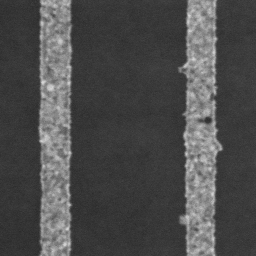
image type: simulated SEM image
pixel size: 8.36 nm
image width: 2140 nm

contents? one or a few lines or trenches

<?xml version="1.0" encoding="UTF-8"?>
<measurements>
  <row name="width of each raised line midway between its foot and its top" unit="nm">230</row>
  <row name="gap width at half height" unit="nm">983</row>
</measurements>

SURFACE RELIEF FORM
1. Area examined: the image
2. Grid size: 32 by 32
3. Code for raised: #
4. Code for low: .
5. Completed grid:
.....####...............###.....
.....####...............###.....
.....####...............###.....
.....####...............###.....
.....####..............####.....
.....####...............###.....
.....####...............###.....
.....####...............###.....
.....####..............####.....
.....####..............####.....
.....####..............####.....
.....####..............####.....
.....####..............####.....
.....####..............####.....
.....####..............####.....
.....####..............####.....
.....####..............####.....
.....####..............####.....
.....####..............####.....
.....####..............####.....
.....####..............####.....
.....####..............####.....
.....####..............####.....
.....####..............####.....
.....####..............####.....
.....####..............####.....
.....####..............####.....
.....####..............####.....
.....####...............###.....
.....####...............###.....
.....####..............####.....
.....####...............###.....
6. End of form